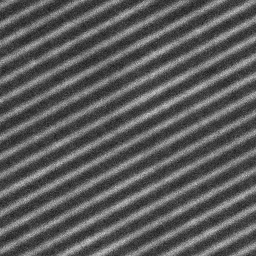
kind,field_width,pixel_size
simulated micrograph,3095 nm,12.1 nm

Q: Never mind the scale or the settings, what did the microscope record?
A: parallel lines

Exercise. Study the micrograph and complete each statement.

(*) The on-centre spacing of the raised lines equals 200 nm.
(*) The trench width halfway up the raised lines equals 145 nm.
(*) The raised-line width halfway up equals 49.2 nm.